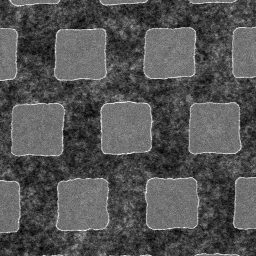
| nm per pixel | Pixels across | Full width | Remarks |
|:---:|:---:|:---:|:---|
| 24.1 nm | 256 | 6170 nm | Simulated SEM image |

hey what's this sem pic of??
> raised bodies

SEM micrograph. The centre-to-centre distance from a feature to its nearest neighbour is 2080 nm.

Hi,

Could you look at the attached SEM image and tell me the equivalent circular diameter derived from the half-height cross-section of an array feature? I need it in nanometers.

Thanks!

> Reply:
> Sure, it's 1360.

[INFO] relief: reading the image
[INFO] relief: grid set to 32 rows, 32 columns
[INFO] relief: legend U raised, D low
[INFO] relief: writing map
DDUUUDDDDDDDDUUDDDDDDDDDDDDDDDDD
DDDDDDDDDDDDDDDDDDDDDDDDDDDDDDDD
DDDDDDDDDDDDDDDDDDDDDDDDDDDDDDDD
DDDDDDDDDDDDDDDDDDDDDDDDDDDDDDUU
UUDDDDDUUUUUUDDDDDUUUUUUDDDDDUUU
UUDDDDDUUUUUUDDDDDUUUUUUDDDDDUUU
UUDDDDDUUUUUUDDDDDUUUUUUDDDDDUUU
UUDDDDDUUUUUUDDDDDUUUUUUDDDDDUUU
UUDDDDDUUUUUUDDDDDUUUUUUDDDDDUUU
UUDDDDDUUUUUUDDDDDUUUUUUDDDDDUUU
DDDDDDDDDDDDDDDDDDDDDDDDDDDDDDDD
DDDDDDDDDDDDDDDDDDDDDDDDDDDDDDDD
DDDDDDDDDDDDDDDDDDDDDDDDDDDDDDDD
DDUUUUUUDDDDDUUUUUUDDDDDUUUUUUDD
DDUUUUUUDDDDDUUUUUUDDDDDUUUUUUDD
DDUUUUUUDDDDDUUUUUUDDDDDUUUUUUDD
DUUUUUUUDDDDDUUUUUUDDDDDUUUUUUDD
DUUUUUUUDDDDDUUUUUUDDDDDUUUUUUDD
DDUUUUUUDDDDDUUUUUUDDDDDUUUUUUDD
DDDDDDDDDDDDDDDDDDDDDDDDDDDDDDDD
DDDDDDDDDDDDDDDDDDDDDDDDDDDDDDDD
DDDDDDDDDDDDDDDDDDDDDDDDDDDDDDDD
DDDDDDDDDUUUUDDDDDDUUUUUDDDDDDUU
UUDDDDDUUUUUUUDDDDUUUUUUUDDDDUUU
UUDDDDDUUUUUUDDDDDUUUUUUUDDDDUUU
UUDDDDDUUUUUUDDDDDUUUUUUUDDDDUUU
UUDDDDDUUUUUUDDDDDUUUUUUUDDDDUUU
UUDDDDDUUUUUUUDDDDUUUUUUUDDDDUUU
UUDDDDDUUUUUUDDDDDDUUUDUDDDDDDUU
DDDDDDDDDDDDDDDDDDDDDDDDDDDDDDDD
DDDDDDDDDDDDDDDDDDDDDDDDDDDDDDDD
DDDDDDDDDDDDDDDDDDDDDDDDDDDDDDDD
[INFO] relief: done